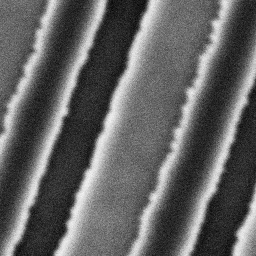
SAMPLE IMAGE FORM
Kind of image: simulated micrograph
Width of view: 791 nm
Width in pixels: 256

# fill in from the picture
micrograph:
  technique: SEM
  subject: lines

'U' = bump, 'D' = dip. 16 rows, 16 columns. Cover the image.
UUUUUUDDDUUUUUUU
UUUUUUDDDUUUUUUU
UUUUUUDDUUUUUUUU
UUUUUDDDUUUUUUUU
UUUUUDDDUUUUUUUU
UUUUUDDUUUUUUUUU
UUUUDDDUUUUUUUUD
UUUUDDDUUUUUUUUD
UUUDDDUUUUUUUUUD
UUUDDDUUUUUUUUDD
UUUDDDUUUUUUUUDD
UUDDDUUUUUUUUUDD
UUDDDUUUUUUUUDDD
UUDDUUUUUUUUUDDD
UDDDUUUUUUUUDDDU
UDDDUUUUUUUUDDDU